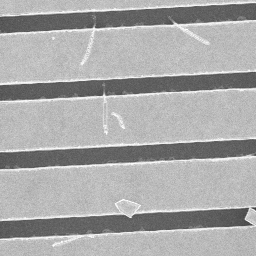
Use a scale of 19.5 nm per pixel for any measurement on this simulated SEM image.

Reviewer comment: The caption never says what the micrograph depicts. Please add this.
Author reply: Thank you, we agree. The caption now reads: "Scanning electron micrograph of lines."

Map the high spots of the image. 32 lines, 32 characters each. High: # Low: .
#############################...
###########.....................
................................
...........#..##################
################################
################################
################################
################################
################################
#####################...........
###.............................
.....................###########
....############################
################################
################################
################################
################################
#############################...
###########.....................
...............................#
..............##################
################################
################################
################################
################################
################################
####################...........#
###............................#
.........................#######
........########################
################################
################################